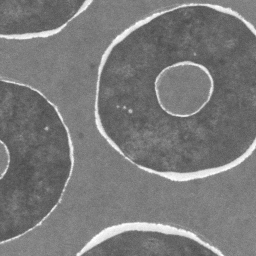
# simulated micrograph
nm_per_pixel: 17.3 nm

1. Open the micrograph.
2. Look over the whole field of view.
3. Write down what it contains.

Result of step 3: ring-shaped grooves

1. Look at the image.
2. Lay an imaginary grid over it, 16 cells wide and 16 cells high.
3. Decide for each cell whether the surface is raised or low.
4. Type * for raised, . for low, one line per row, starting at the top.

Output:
.....******..***
....*****......*
********........
*******.........
******....***...
..****....***...
...***....***...
....**..........
....***.........
....****.......*
....*****.....**
....************
....************
...*************
..*****....*****
*****........***